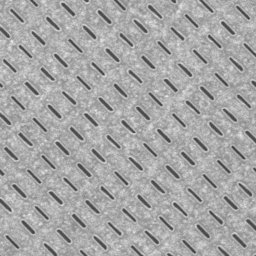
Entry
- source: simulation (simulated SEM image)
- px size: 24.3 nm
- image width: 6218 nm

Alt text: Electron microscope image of a regular array of holes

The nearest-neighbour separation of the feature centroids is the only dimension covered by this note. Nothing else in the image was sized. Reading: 483 nanometres